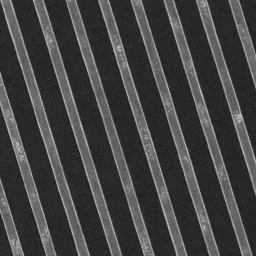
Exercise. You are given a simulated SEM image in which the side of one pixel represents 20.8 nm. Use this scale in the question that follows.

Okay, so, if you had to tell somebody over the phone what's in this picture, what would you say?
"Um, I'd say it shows parallel lines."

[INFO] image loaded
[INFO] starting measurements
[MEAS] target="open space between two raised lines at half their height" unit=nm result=456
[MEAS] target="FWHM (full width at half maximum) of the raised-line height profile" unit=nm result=209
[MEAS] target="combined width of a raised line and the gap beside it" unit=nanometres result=650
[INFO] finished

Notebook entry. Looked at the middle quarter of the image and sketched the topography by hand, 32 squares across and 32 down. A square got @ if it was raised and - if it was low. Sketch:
-----@@@-----@@@------@@------@@
------@@------@@------@@@-----@@
------@@@-----@@@-----@@@------@
@-----@@@-----@@@------@@------@
@------@@------@@------@@@-----@
@------@@@-----@@@-----@@@------
@@-----@@@-----@@@------@@------
@@------@@------@@------@@@-----
@@------@@------@@@-----@@@-----
@@@-----@@@------@@------@@-----
@@@------@@------@@------@@-----
-@@------@@------@@------@@@----
-@@@-----@@@-----@@@------@@----
-@@@------@@------@@------@@----
--@@------@@------@@------@@@---
--@@------@@@-----@@@-----@@@---
--@@@------@@------@@------@@---
--@@@------@@------@@------@@---
---@@------@@@-----@@@-----@@@--
---@@@-----@@@------@@------@@--
----@@------@@------@@------@@@-
----@@------@@------@@@-----@@@-
----@@@-----@@@-----@@@------@@-
-----@@------@@------@@------@@@
-----@@------@@------@@@-----@@@
-----@@@-----@@@-----@@@------@@
-----@@@------@@------@@------@@
------@@------@@------@@@-----@@
------@@------@@@-----@@@-----@@
@-----@@@------@@------@@------@
@-----@@@------@@------@@@-----@
@------@@------@@------@@@-----@